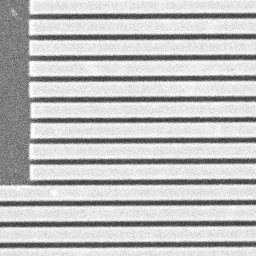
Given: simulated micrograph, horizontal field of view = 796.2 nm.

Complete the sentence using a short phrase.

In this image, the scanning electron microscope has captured parallel lines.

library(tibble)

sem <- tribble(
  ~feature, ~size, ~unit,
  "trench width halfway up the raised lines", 19.8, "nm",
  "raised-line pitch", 64.7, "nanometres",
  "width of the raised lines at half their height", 45.1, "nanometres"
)